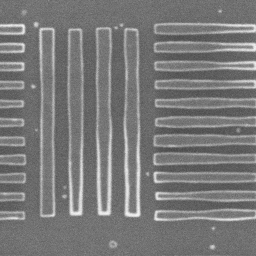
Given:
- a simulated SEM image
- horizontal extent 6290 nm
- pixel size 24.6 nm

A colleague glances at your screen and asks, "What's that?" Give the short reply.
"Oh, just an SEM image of groups of lines, slits or small figures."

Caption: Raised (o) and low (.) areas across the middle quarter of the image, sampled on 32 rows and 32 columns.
.oooo...ooo.....oo.....ooooooooo
.oooo...ooo.....oo.....ooooooooo
.oooo...ooo.....oo..............
.oooo...ooo.....oo..............
.oooo...ooo.....oo.....ooooooooo
.oooo...ooo.....ooo....ooooooooo
.oooo...ooo.....ooo.............
.oooo...ooo.....ooo.............
.oooo...ooo....oooo.............
.oooo...ooo....oooo....ooooooooo
.oooo...ooo....oooo....ooooooooo
.oooo...ooo....oooo.............
.oooo...ooo....oooo.............
.oooo...ooo....oooo.......oooooo
..ooo...oooo...oooo....ooooooooo
..ooo...oooo...oooo......ooooooo
..ooo...oooo...oooo.............
..ooo...oooo...oooo.............
..ooo...oooo...oooo....ooooooooo
..ooo...ooo.....ooo....ooooooooo
..ooo...ooo.....ooo....oooooooo.
..ooo...ooo.....ooo.............
..oo.....oo.....ooo.....oooooo..
..oo.....oo.....ooo....ooooooooo
..oo.....oo.....ooo....ooooooooo
..oo.....oo.....ooo.............
..oo.....oo.....ooo.............
..oo.....oo.....ooo....ooooooooo
..oo.....oo.....ooo....ooooooooo
..oo.....oo.....ooo.............
..oo.....oo.....ooo.............
..oo.....oo.....oo..............